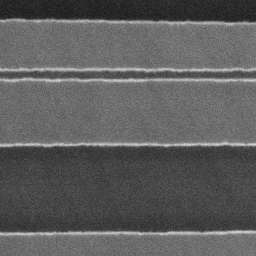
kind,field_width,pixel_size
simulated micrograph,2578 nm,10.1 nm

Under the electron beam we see lines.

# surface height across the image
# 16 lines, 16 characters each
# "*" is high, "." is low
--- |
................
****************
****************
****************
****************
****************
****************
****************
****************
................
................
................
................
................
................
****************